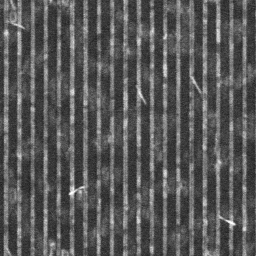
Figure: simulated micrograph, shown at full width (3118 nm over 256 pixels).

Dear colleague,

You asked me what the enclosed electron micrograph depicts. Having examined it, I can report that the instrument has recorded parallel lines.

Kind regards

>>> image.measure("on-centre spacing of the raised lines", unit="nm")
161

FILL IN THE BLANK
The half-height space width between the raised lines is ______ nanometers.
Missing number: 126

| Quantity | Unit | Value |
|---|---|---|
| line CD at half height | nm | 33.5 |